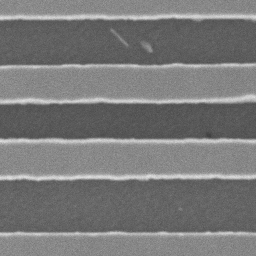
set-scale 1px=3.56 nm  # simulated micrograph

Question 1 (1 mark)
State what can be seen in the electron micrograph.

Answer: lines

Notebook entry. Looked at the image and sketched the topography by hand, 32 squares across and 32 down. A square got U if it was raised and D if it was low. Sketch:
UUUUUUUUUUUUUUUUUUUUUUUUUUUUUUUU
UUUUUUUUUUUUUUUUUUUUUUUUUUUUUUUU
DDDDDDDDDDDDDDDDDDDDDDDDDDDDDDDD
DDDDDDDDDDDDDDDDDDDDDDDDDDDDDDDD
DDDDDDDDDDDDDDDDDDDDDDDDDDDDDDDD
DDDDDDDDDDDDDDDDDDDDDDDDDDDDDDDD
DDDDDDDDDDDDDDDDDDDDDDDDDDDDDDDD
DDDDDDDDDDDDDDDDDDDDDDDDDDDDDDDD
UUUUUUUUUUUUUUUUUUUUUUUUUUUUUUUU
UUUUUUUUUUUUUUUUUUUUUUUUUUUUUUUU
UUUUUUUUUUUUUUUUUUUUUUUUUUUUUUUU
UUUUUUUUUUUUUUUUUUUUUUUUUUUUUUUU
UUUUUUUUUUUUUUUUUUUUUUUUUUUUUUUU
DDDDDDDDDDDDDDDDDDDDDDDDDDDDDDDD
DDDDDDDDDDDDDDDDDDDDDDDDDDDDDDDD
DDDDDDDDDDDDDDDDDDDDDDDDDDDDDDDD
DDDDDDDDDDDDDDDDDDDDDDDDDDDDDDDD
UUUUUUUUUUUUUUUUUUUUUUUUUUUUUUUU
UUUUUUUUUUUUUUUUUUUUUUUUUUUUUUUU
UUUUUUUUUUUUUUUUUUUUUUUUUUUUUUUU
UUUUUUUUUUUUUUUUUUUUUUUUUUUUUUUU
UUUUUUUUUUUUUUUUUUUUUUUUUUUUUUUU
DDDDDDDDDDDDDDDDDDDDDDDDDDDDDDDD
DDDDDDDDDDDDDDDDDDDDDDDDDDDDDDDD
DDDDDDDDDDDDDDDDDDDDDDDDDDDDDDDD
DDDDDDDDDDDDDDDDDDDDDDDDDDDDDDDD
DDDDDDDDDDDDDDDDDDDDDDDDDDDDDDDD
DDDDDDDDDDDDDDDDDDDDDDDDDDDDDDDD
DDDDDDDDDDDDDDDDDDDDDDDDDDDDDDDD
UUUUUUUUUUUUUUUUUUUUUUUUUUUUUUUU
UUUUUUUUUUUUUUUUUUUUUUUUUUUUUUUU
UUUUUUUUUUUUUUUUUUUUUUUUUUUUUUUU